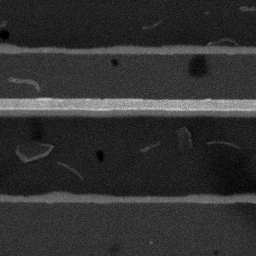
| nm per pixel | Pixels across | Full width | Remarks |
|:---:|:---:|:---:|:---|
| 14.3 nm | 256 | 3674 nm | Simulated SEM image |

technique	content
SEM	lines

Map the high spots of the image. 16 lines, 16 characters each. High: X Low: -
----------------
----------------
----------------
XXXXXXXXXXXXXXXX
XXXXXXXXXXXXXXXX
XXXXXXXXXXXXXXXX
XXXXXXXXXXXXXXXX
----------------
----------------
----------------
----------------
----------------
---X------------
XXXXXXXXXXXXXXXX
XXXXXXXXXXXXXXXX
XXXXXXXXXXXXXXXX